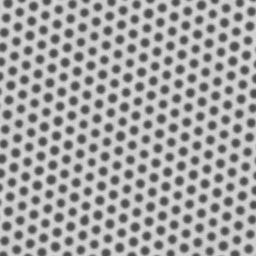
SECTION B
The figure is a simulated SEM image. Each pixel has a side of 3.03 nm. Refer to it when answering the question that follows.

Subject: a regular array of holes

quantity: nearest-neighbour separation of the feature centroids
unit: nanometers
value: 43.9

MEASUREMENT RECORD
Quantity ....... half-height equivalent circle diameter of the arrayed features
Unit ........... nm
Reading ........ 28